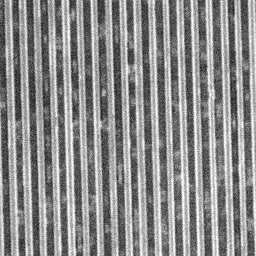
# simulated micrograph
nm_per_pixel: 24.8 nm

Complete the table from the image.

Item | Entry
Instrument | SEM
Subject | parallel lines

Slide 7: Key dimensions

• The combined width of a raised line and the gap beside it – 14.3 px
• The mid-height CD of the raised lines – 0.121 microns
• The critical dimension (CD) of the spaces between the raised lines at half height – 9.62 px